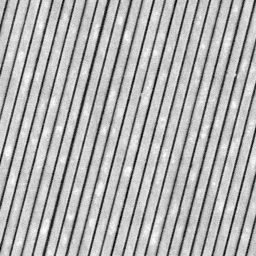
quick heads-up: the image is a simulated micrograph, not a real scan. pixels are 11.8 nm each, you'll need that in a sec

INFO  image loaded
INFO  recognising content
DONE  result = parallel lines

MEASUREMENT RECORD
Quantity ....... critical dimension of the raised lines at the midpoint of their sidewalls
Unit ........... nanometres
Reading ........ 99.7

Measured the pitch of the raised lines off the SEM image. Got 128 nanometers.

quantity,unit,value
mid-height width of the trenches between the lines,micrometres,0.0328